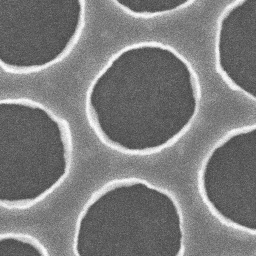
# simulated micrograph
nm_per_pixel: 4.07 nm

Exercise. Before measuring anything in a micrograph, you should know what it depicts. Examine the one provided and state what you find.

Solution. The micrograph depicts holes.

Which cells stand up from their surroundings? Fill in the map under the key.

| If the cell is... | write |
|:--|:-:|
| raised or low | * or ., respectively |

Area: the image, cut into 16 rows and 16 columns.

.....***...***..
.....*********..
....**********..
....***....***..
*******.....**..
******......***.
.*****......****
...***......****
....***....****.
....*********...
....*********...
...****..****...
..****.....**...
*****......***..
*****......*****
..***......*****